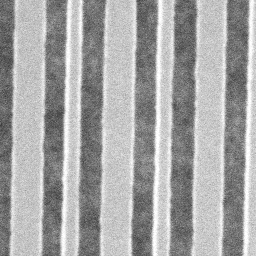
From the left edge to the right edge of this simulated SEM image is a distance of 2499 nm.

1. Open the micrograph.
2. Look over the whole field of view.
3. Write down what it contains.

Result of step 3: lines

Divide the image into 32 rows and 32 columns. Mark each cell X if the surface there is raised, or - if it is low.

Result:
--XXXX---X---XXXX---XX---XXX---X
--XXXX---X---XXXX---XX---XXX---X
--XXXX---X---XXXX---XX---XXX---X
--XXXX--XX---XXXX---XX---XXX---X
--XXXX--XX---XXXX---XX---XXX---X
--XXX---XX---XXXX---XX---XXX---X
--XXX---XX---XXXX---XX---XXX---X
--XXX---XX---XXXX---XX---XXX---X
--XXX---XX---XXXX---X---XXXX---X
--XXX---XX---XXXX---X---XXXX---X
--XXX---XX---XXXX---X----XXX---X
--XXX---XX---XXXX---X----XXX---X
--XXX---XX---XXXX---X---XXXX---X
--XXX---XX---XXXX---X---XXXX---X
--XXX---XX---XXXX---X---XXXX---X
--XXX---XX---XXXX---X---XXXX---X
--XXX---XX---XXXX---X---XXXX---X
--XXX---XX---XXXX---X---XXXX---X
--XXX---XX---XXXX--XX---XXXX---X
--XXX---XX---XXXX--XX---XXXX---X
--XXX---XX---XXXX--XX---XXXX---X
--XXX---XX---XXXX--XX---XXXX---X
--XXX---XX---XXXX--XX---XXXX---X
-XXXX---XX---XXX---XX---XXXX---X
-XXXX---XX---XXX---XX---XXXX---X
-XXXX---XX---XXX---XX---XXXX---X
-XXXX---XX---XXX---XX---XXXX---X
-XXXX---XX---XXX---XX---XXXX---X
-XXXX---XX---XXX---XX---XXXX---X
-XXXX---XX---XXX---XX---XXXX---X
-XXXX---XX---XXX---XX---XXXX---X
-XXXX---XX---XXX---XX---XXXX---X